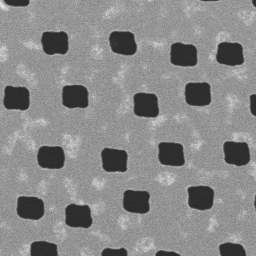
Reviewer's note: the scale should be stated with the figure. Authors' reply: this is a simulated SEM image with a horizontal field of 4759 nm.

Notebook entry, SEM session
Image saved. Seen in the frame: a regular array of holes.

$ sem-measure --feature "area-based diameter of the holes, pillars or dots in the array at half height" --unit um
0.495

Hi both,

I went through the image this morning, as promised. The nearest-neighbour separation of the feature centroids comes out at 976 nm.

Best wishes